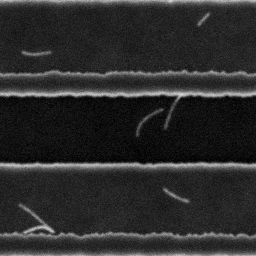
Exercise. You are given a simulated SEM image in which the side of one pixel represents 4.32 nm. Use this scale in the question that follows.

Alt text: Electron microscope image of lines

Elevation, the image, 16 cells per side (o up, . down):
oooooooooooooooo
oooooooooooooooo
oooooooooooooooo
oooooooooooooooo
oooooooooooooooo
oooooooooooooooo
................
................
................
................
oooooooooooooooo
oooooooooooooooo
oooooooooooooooo
oooooooooooooooo
oooooooooooooooo
oooooooooooooooo